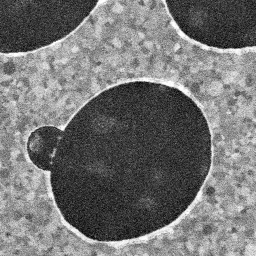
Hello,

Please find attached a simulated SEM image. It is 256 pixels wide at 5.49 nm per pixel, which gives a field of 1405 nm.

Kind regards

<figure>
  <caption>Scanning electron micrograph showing holes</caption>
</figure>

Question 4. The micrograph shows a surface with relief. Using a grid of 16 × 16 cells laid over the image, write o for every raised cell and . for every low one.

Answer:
......oooo......
.....oooooo.....
....oooooooo....
oooooooooooooooo
oooooooooooooooo
ooooooo....ooooo
ooooo.......oooo
oooo.........ooo
oo...........ooo
oo...........ooo
oo...........ooo
ooo..........ooo
ooo.........oooo
oooo.......ooooo
ooooo.....oooooo
oooooooooooooooo